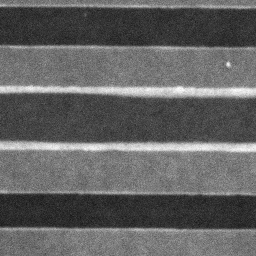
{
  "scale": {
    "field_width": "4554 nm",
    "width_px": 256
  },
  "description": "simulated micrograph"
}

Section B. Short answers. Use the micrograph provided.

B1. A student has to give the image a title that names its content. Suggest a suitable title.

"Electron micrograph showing lines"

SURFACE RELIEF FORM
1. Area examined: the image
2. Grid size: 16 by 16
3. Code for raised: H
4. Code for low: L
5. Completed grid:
LLLLLLLLLLLLLLLL
LLLLLLLLLLLLLLLL
LLLLLLLLLLLLLLLL
HHHHHHHHHHHHHHHH
HHHHHHHHHHHHHHHH
HHHHHHHHHHHHHHHH
LLLLLLLLLLLLLLLL
LLLLLLLLLLLLLLLL
LLLLLLLLLLLLLLLL
HHHHHHHHHHHHHHHH
HHHHHHHHHHHHHHHH
HHHHHHHHHHHHHHHH
LLLLLLLLLLLLLLLL
LLLLLLLLLLLLLLLL
HHHHHHHHHHHHHHHH
HHHHHHHHHHHHHHHH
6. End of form